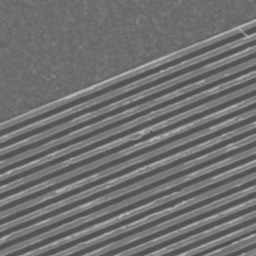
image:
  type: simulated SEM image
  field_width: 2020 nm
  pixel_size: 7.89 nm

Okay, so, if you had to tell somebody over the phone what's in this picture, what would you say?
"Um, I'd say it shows parallel lines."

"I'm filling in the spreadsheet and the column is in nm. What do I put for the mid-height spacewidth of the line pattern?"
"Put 42.9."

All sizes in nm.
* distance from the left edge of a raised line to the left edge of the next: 92.8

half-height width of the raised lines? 50.2 nanometres